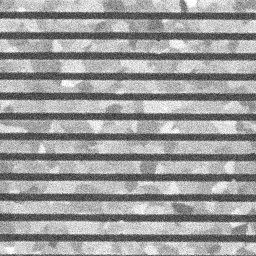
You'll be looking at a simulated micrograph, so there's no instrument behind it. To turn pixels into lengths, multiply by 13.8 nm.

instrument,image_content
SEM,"parallel lines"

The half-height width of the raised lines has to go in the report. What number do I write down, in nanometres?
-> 166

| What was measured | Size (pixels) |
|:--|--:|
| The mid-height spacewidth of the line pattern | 8.25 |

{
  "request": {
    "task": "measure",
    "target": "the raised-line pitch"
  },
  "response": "280 nm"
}